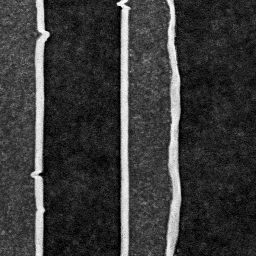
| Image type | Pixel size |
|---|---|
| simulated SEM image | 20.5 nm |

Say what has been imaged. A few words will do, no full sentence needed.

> one or a few lines or trenches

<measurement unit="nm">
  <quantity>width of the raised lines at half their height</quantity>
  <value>1010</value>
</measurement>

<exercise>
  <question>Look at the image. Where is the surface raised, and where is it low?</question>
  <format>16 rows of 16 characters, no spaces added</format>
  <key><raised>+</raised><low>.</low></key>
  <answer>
++......+++.....
+++.....+++.....
+++.....+++.....
++......+++.....
++......+++.....
++......+++.....
++......+++.....
++......+++.....
++......+++.....
++......+++.....
++......+++.....
++......+++.....
++......+++.....
+++.....+++.....
++......+++.....
++......+++.....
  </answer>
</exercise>